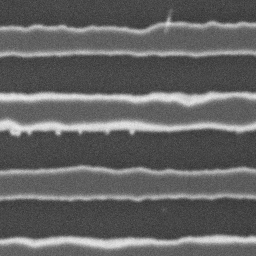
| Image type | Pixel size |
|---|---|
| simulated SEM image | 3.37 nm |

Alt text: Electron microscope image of lines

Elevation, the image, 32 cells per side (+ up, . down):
................................
................................
................................
+++.+++++..++++....+++++++++++++
++++++++++++++++++++++++++++++++
++++++++++++++++++++++++++++++++
++++++++++++++++++++++++++++++++
................................
................................
................................
................................
................................
++++++++++++++++++++++++++++++++
++++++++++++++++++++++++++++++++
++++++++++++++++++++++++++++++++
++++++++++++++++++++++++++++++++
................................
................................
................................
................................
................................
++++++++++++++++++++++++++++++++
++++++++++++++++++++++++++++++++
++++++++++++++++++++++++++++++++
++++++++++++++++++++++++++++++++
................................
................................
................................
................................
................................
++++++++++++++++++++++++++++++++
++++++++++++++++++++++++++++++++